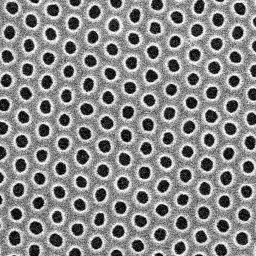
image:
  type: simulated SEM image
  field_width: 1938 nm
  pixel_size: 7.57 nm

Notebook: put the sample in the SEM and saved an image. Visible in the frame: a regular array of holes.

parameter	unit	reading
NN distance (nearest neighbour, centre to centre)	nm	177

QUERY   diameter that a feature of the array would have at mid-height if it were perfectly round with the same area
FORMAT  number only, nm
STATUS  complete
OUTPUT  97.3